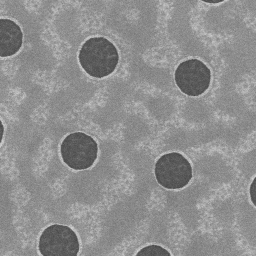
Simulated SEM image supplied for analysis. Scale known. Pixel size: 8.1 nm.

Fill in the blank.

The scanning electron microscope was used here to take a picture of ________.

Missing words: holes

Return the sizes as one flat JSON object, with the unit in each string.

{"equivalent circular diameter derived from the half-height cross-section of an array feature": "309 nm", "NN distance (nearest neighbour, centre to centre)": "774 nm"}